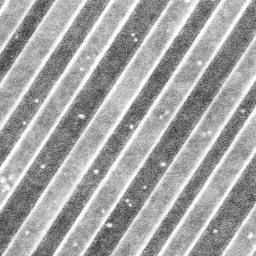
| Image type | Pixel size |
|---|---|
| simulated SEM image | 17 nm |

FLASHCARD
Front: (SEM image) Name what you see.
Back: lines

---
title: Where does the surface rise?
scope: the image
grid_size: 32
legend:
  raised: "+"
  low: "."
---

.+++...+++....+++....+++...++++.
+++...++++...+++....++++...+++..
+++..++++...++++....+++...++++..
++...+++....+++....++++...+++...
+...++++...+++....++++...+++....
+..++++...++++....+++...++++...+
...+++....+++....++++...+++....+
..++++...+++....++++...+++....++
.++++...++++....+++...++++...+++
.+++....+++....++++...+++....+++
++++...+++....++++...+++....+++.
+++...++++....+++...++++...++++.
++....+++....++++...+++....+++..
++...+++.....+++...+++....+++...
+...++++....+++...++++...++++..+
....+++....++++...+++....+++...+
...+++....++++...+++....++++..++
..++++....+++...++++...++++..+++
..+++....++++...+++....+++...+++
.+++.....+++...+++....++++..++++
++++....+++...++++...++++..++++.
+++....++++...+++....+++...+++..
+++....+++...+++....++++..++++..
++....+++...++++...++++..++++...
+....++++...+++....+++...+++....
.....+++...+++....++++..++++....
....+++...++++...++++..++++....+
...++++...+++....+++...+++.....+
...+++...++++...++++..++++....++
..+++...++++...++++..++++....+++
.++++...+++....+++...+++.....+++
.+++...+++....++++..++++....++++